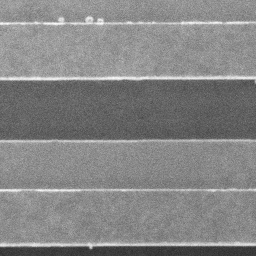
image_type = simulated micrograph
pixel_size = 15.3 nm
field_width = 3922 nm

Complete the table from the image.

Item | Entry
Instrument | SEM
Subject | lines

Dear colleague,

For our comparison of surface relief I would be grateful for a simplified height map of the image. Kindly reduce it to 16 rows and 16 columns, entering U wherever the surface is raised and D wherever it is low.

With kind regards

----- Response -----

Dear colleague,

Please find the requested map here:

UUUUUUUUUUUUUUUU
UUUUUUUUUUUUUUUU
UUUUUUUUUUUUUUUU
UUUUUUUUUUUUUUUU
UUUUUUUUUUUUUUUU
DDDDDDDDDDDDDDDD
DDDDDDDDDDDDDDDD
DDDDDDDDDDDDDDDD
DDDDDDDDDDDDDDDD
UUUUUUUUUUUUUUUU
UUUUUUUUUUUUUUUU
UUUUUUUUUUUUUUUU
UUUUUUUUUUUUUUUU
UUUUUUUUUUUUUUUU
UUUUUUUUUUUUUUUU
DDDDDDDDDDDDDDDD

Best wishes